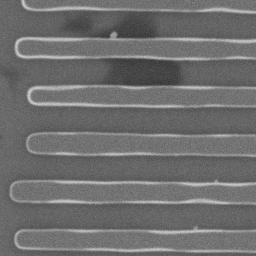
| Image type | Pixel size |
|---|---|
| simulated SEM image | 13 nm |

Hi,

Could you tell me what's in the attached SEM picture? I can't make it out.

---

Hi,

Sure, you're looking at groups of lines, slits or small figures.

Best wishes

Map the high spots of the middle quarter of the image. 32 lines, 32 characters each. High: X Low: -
--------------------------------
--------------------------------
--------------------------------
--------------------------------
--------------------------------
--------------------------------
XXXXXXXXXXXXXXXXXXXXXXXXXXXXXXXX
XXXXXXXXXXXXXXXXXXXXXXXXXXXXXXXX
XXXXXXXXXXXXXXXXXXXXXXXXXXXXXXXX
XXXXXXXXXXXXXXXXXXXXXXXXXXXXXXXX
--------------------XXXXXXXXXXXX
--------------------------------
--------------------------------
--------------------------------
--------------------------------
--------------------------------
--------------------------------
XXXXXXXXXXXX--------------------
XXXXXXXXXXXXXXXXXXXXXXXXXXXXXXXX
XXXXXXXXXXXXXXXXXXXXXXXXXXXXXXXX
XXXXXXXXXXXXXXXXXXXXXXXXXXXXXXXX
XXXXXXXXXXXXXXXXXXXXXXXXXXXXXXXX
--XXXXXXXXX-----------XXXXXXXXX-
--------------------------------
--------------------------------
--------------------------------
--------------------------------
--------------------------------
--------------------------------
--------------------------------
XXXXXXXXXXXXXXXXXXXXXXXXXXXXXXXX
XXXXXXXXXXXXXXXXXXXXXXXXXXXXXXXX